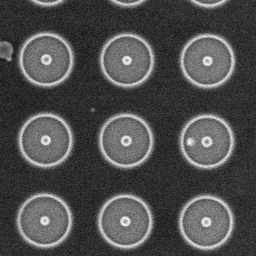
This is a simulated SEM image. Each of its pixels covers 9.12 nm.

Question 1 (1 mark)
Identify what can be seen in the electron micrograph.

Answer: an array of small figures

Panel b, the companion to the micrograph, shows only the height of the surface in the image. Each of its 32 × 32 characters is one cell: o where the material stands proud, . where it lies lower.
ooooooooooooooooooooooooo..ooooo
oooooooooooooooooooooooooooooooo
oooooooooooooooooooooooooooooooo
oooooooooooooooooooooooooooooooo
ooooo..ooooooooooooooooooooooooo
ooo.....oooooo....oooooo....oooo
ooo......oooo......oooo......ooo
ooo..o...oooo..o...oooo......ooo
ooo......oooo......oooo......ooo
ooo.....oooooo....oooooo....oooo
ooooooooooooooo..oooooooo..ooooo
oooooooooooooooooooooooooooooooo
oooooooooooooooooooooooooooooooo
oooooooooooooooooooooooooooooooo
ooooo.oooooooooooooooooooooooooo
oooo....ooooo.....oooooo....oooo
ooo.....ooooo......oooo......ooo
ooo..o...oooo..o...oooo..o...ooo
ooo......oooo......oooo......ooo
ooo.....ooooo.....ooooo.....oooo
ooooo.ooooooooo..oooooooo..ooooo
oooooooooooooooooooooooooooooooo
oooooooooooooooooooooooooooooooo
oooooooooooooooooooooooooooooooo
oooooooooooooooooooooooooooooooo
ooo.....ooooo.....oooooo....oooo
ooo.....ooooo.....ooooo......ooo
oo...o...oooo..o...oooo......ooo
ooo.....ooooo......oooo......ooo
ooo.....ooooo.....ooooo.....oooo
ooooo.ooooooooo..ooooooo...ooooo
oooooooooooooooooooooooooooooooo